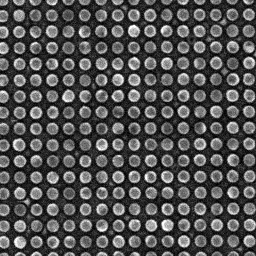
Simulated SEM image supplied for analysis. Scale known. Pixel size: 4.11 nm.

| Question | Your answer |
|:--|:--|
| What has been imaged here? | a regular array of raised bodies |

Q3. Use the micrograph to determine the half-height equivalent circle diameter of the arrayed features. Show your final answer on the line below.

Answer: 47.1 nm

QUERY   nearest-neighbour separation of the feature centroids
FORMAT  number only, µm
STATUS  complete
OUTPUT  0.065